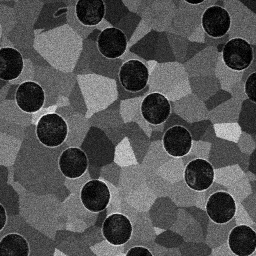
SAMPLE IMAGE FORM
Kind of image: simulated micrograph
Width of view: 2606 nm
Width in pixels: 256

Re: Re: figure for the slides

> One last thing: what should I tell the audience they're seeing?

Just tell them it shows a regular array of holes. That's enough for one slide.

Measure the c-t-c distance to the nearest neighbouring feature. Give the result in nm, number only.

402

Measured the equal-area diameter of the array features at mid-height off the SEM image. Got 314 nanometers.